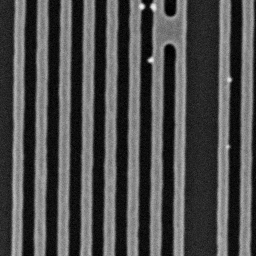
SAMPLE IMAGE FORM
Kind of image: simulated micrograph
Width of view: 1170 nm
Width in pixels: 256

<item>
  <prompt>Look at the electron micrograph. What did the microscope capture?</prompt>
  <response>groups of lines, slits or small figures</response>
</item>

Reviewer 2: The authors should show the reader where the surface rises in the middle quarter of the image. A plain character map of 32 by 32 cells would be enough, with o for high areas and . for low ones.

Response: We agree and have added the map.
oo...oo....oo...ooo...ooo...oo..
oo...oo....oo...ooo...ooo...oo..
o....oo....oo...ooo...ooo...oo..
o....oo....oo...ooo...ooo...oo..
oo...oo....oo...ooo...ooo...oo..
oo...oo....oo...ooo...ooo...oo..
o....oo...ooo...ooo...ooo...oo..
o....oo...ooo...ooo...ooo...oo..
o....oo...ooo...ooo...ooo...oo..
o....oo...ooo...ooo...ooo...oo..
o....oo....oo...ooo...ooo...oo..
o....oo....oo...ooo...ooo...oo..
o....oo...ooo...ooo...ooo...oo..
o....oo...ooo...ooo...oo....oo..
o....oo...ooo...ooo...oo....oo..
o....oo...ooo...ooo...oo....oo..
o....oo...ooo...ooo...oo....oo..
o....oo...ooo...ooo...oo....oo..
o....oo...ooo...ooo...oo....oo..
o....oo...ooo...ooo...oo....oo..
o....oo...ooo...ooo...oo....oo..
o....oo...ooo...ooo...oo....oo..
o....oo...ooo...ooo...oo....oo..
o....oo...ooo...oo....oo....oo..
o....oo...ooo...ooo...oo....oo..
o....oo...ooo...ooo...oo....oo..
o....oo...ooo...ooo...oo....oo..
o....oo...ooo...ooo...oo....oo..
o...ooo...ooo...ooo...oo....oo..
o...ooo...ooo...ooo...oo....oo..
o....oo...ooo...oo....oo....oo..
o...ooo...ooo...oo....oo....oo..